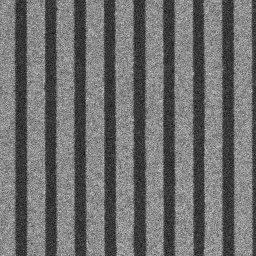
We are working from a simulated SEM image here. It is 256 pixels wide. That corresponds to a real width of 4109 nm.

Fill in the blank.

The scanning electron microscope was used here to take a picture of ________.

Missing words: parallel lines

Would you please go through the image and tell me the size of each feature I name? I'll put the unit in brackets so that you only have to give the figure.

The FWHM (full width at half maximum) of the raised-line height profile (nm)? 279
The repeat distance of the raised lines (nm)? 475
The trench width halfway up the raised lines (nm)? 193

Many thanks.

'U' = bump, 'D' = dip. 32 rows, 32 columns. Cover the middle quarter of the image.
UUDDDDUUUUDDDUUUUDDDDUUUUDDDUUUU
UUDUDDUUUUDDDUUUUDDUDUUUUDDDUUUU
UUDDDDUUUUDDDUUUUDDDDUUUUDDDUUUU
UUDDDDUUUUUDDUUUUDDDDUUUUDDDUUUU
UUDDDDUUUUDDDUUUUDDDDUUUUDDDUUUU
UUDDDDUUUUDDDUUUUDDDDUUUUDDDUUUU
UUDDDDUUUUDDDUUUUDDDDUUUUDDDUUUU
UUDDDDUUUUDDDUUUUDDDDUUUUDDDUUUU
UUDDDDUUUUDDDUUUUDDDDUUUUDDDUUUU
UUDDDDUUUUDDDUUUUDDDDUUUUDDDUUUU
UUDDDDUUUUDDDUUUUDDDDUUUUDDDUUUU
UUDDDDUUUUDDDUUUUDDDDUUUUDDDUUUU
UUDDDDUUUUDDDUUUUDUDDUUUUDDDUUUU
UUDDDDUUUUDDDUUUUDDDDUUUUDDDUUUU
UUDDDDUUUUDDDUUUUDDDDUUUUDDUUUUU
UUDDDUUUUUDDDUUUUDDDDUUUUDDUUUUU
UUDUUUUUUUDDDUUUUDDDDUUUUDUUUUUU
UUDDDDUUUUDDDUUUUDDDDUUUUDDUUUUU
UUDDDDUUUUDDDUUUUDDDDUUUUDDDUUUU
UUDDDDUUUUDDDUUUUDDDDUUUUDUUUUUU
UUDDDDUUUUDDDUUUUDDDDUUUUUUUUUUU
UUDDDDUUUUDDDUUUUDDDDUUUUDDDUUUU
UUDDDDUUUUDDDUUUUDDDDUUUUDDDUUUU
UUDDDUUUUUDDDUUUUDDDDUUUUDDDUUUU
UUDDDUUUUUDDDUUUUDDDDUUUUDDDUUUU
UUDDDDUUUUDDDUUUUDDDDUUUUDDDUUUU
UUDDDUUUUUDDDUUUUDDDDUUUUDDDUUUU
UUDDDUUUUUDDDUUUUDDDDUUUUDDDUUUU
UUDDDDUUUUDDDUUUUDDDDUUUUDDDUUUU
UUDDDDUUUUDDDUUUUDDDDUUUUDDDUUUU
UUDDDDUUUUDDDUUUUDDDDUUUUDDDUUUU
UUDDDDUUUUDDDUUUUDDDDUUUUDDDUUUU